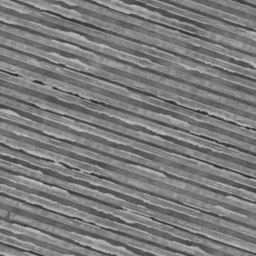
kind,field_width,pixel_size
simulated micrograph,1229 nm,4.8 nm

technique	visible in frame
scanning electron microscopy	parallel lines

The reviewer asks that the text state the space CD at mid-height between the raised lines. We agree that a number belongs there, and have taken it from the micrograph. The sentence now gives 21 nm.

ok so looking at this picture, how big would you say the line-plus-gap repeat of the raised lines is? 56.2 nm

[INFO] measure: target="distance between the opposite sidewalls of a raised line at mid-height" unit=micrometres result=0.0335